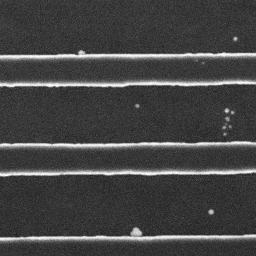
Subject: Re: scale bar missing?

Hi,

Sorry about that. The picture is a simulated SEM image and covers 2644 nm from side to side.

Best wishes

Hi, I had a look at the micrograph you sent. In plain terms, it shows lines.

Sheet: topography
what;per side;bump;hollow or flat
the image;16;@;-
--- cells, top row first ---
----------------
----------------
----------------
-@@@@@@@@@@@@@@@
@@@@@@@@@@@@@@@@
----------------
----------------
----------------
----------------
@@@@@@@@@@@@@@@@
@@@@@@@@@@@@@@@@
----------------
----------------
----------------
----------------
@@@@@@@@@@@@@@@@